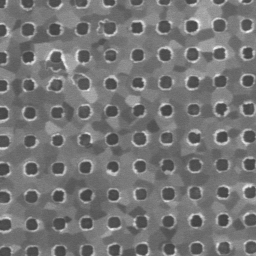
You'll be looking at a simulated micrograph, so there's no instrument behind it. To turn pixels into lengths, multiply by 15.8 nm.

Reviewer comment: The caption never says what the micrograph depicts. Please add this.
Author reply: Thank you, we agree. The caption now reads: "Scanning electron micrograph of a regular array of holes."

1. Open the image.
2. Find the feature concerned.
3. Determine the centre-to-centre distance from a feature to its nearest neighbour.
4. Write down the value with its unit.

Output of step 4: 0.428 µm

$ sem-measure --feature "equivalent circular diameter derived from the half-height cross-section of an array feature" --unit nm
198